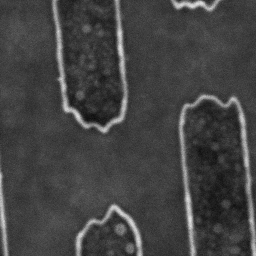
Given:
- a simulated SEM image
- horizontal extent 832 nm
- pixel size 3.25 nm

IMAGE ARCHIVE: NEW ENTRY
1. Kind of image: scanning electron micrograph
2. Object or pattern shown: one or a few lines or trenches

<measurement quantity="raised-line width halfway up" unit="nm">206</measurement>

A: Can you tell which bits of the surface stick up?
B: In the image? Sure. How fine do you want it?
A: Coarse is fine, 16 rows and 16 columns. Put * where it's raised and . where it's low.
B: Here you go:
...****.........
....***.........
....****........
....****........
....****........
....****........
....****....***.
.....**....****.
...........****.
...........****.
...........*****
............****
............****
.......*....****
.....****...****
.....****...****